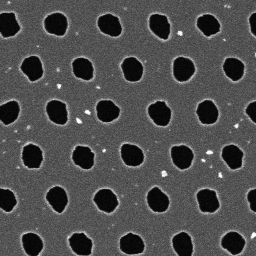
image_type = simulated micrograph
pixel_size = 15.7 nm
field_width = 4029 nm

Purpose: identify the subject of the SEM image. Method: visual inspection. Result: a regular array of holes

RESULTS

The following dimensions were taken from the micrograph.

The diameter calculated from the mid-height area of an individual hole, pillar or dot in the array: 0.362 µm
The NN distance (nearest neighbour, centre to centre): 771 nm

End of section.